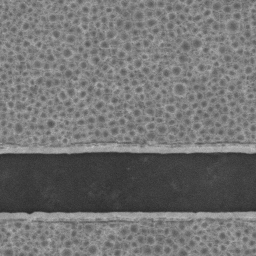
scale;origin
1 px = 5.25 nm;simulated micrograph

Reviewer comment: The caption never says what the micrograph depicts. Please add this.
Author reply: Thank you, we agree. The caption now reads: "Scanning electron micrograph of one or a few lines or trenches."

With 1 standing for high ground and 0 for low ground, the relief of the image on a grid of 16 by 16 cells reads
1111111111111111
1111111111111111
1111111111111111
1111111111111111
1111111111111111
1111111111111111
1111111111111111
1111111111111111
1111111111111111
0000000000000000
0000000000000000
0000000000000000
0000000000000000
0010000101111101
1111111111111111
1111111111111111